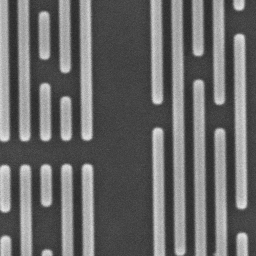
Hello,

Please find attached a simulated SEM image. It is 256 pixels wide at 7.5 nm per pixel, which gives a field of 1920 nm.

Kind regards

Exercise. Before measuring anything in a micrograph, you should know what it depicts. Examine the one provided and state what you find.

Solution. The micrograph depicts groups of lines, slits or small figures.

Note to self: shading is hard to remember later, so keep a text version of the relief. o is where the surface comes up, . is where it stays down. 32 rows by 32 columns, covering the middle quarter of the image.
o...ooo...............oo...ooo..
o...ooo...............oo...ooo..
.....oo...............oo...ooo..
.....oo...............oo...ooo..
.....oo...............oo...ooo..
.....oo...............oo...ooo..
.....oo...............oo...ooo..
.....oo...............ooo..ooo..
o....oo...............ooo..ooo..
o....oo................o...ooo..
o....oo....................ooo..
o....oo....................ooo..
o....oo....................ooo..
oo...oo.....................oo..
oo...oo.....................oo..
oo...oo.....................oo..
oo...oo................o....oo..
oo...oo...............ooo...oo..
o....oo...............ooo...oo..
......................ooo...oo..
......................ooo...oo..
......................ooo...oo..
......................ooo...oo..
......................ooo...oo..
......................ooo...oo..
o....oo...............ooo...oo..
oo...oo................oo...oo..
oo...oo................oo...oo..
oo...oo................oo...oo..
oo...oo................oo...oo..
oo...oo................oo...oo..
oo...oo................oo...oo..